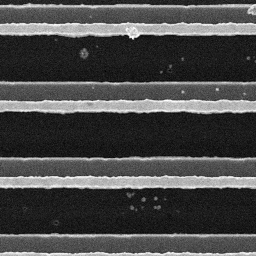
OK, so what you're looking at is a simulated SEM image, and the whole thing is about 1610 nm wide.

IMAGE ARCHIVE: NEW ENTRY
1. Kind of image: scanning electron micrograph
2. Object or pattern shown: lines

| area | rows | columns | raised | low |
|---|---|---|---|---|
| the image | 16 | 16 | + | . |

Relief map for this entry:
++++++++++++++++
++++++++++++++++
................
................
................
++++++++++++++++
++++++++++++++++
................
................
................
++++++++++++++++
++++++++++++++++
................
................
................
++++++++++++++++